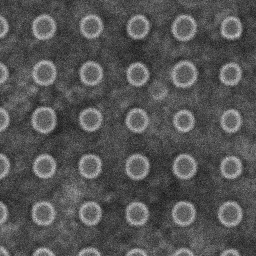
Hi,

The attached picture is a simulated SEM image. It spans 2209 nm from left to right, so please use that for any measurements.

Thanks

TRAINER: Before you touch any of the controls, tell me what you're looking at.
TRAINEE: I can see a regular array of raised bodies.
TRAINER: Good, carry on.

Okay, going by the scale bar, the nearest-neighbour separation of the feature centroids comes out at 398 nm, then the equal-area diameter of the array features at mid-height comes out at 188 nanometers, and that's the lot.